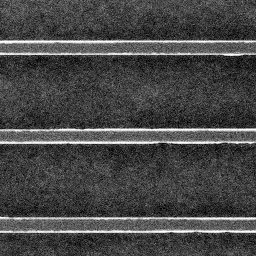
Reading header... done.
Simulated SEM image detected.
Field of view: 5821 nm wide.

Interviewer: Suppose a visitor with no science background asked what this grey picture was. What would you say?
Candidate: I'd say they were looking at lines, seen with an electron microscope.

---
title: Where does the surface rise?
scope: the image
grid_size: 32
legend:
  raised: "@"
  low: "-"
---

--------------------------------
--------------------------------
--------------------------------
--------------------------------
--------------------------------
@@@@@@@@@@@@@@@@@@@@@@@@@@@@@@@@
@@@@@@@@@@@@@@@@@@@@@@@@@@@@@@@@
--------------------------------
--------------------------------
--------------------------------
--------------------------------
--------------------------------
--------------------------------
--------------------------------
--------------------------------
--------------------------------
@@@@@@@@@@@@@@@@@@@@@@@@@@@@@@@@
@@@@@@@@@@@@@@@@@@@@@@@@@@@@@@@@
--------------------------------
--------------------------------
--------------------------------
--------------------------------
--------------------------------
--------------------------------
--------------------------------
--------------------------------
--------------------------------
@@@@@@@@@@@@@@@@@@@@@@@@@@@@@@@@
@@@@@@@@@@@@@@@@@@@@@@@@@@@@@@@@
--------------------------------
--------------------------------
--------------------------------